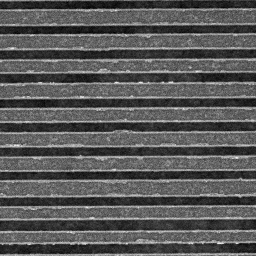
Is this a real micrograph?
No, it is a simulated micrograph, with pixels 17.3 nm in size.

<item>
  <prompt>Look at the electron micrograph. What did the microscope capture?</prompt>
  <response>parallel lines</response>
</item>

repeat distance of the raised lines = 0.423 µm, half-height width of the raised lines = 240 nm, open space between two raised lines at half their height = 0.175 um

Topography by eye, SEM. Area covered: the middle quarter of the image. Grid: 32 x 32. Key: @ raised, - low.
@@@@@@@@@@@@@@@@@@@@@@@@@@@@@@@@
@@@@@@@@@@@@@@@@@@@@@@@@@@@@@@@@
--------------------------------
--------------------------------
--------------------------------
@@@@@@@@@@@@@@@@@@@@@@@@@@@@@@@@
@@@@@@@@@@@@@@@@@@@@@@@@@@@@@@@@
@@@@@@@@@@@@@@@@@@@@@@@@@@@@@@@@
@@-@@@--------------------------
--------------------------------
--------------------------------
@@@@@@@@@@@@@@@@@@@@@@@@@@@@@@@@
@@@@@@@@@@@@@@@@@@@@@@@@@@@@@@@@
@@@@@@@@@@@@@@@@@@@@@@@@@@@@@@@@
--------------------------------
--------------------------------
--------------------------------
@@@@@@@@@@@@@@@@@@@@@@@@@@@@@@@@
@@@@@@@@@@@@@@@@@@@@@@@@@@@@@@@@
@@@@@@@@@@@@@@@@@@@@@@@@@@@@@@@@
@@@@@@@@@@@@@@@@----------------
--------------------------------
--------------------------------
@@@@@@@@@@@@@@@@@@@@@@@@@@@@@@@@
@@@@@@@@@@@@@@@@@@@@@@@@@@@@@@@@
@@@@@@@@@@@@@@@@@@@@@@@@@@@@@@@@
@@@@@@@@@@@@@@@@@@-----@@-------
--------------------------------
--------------------------------
@@@@@@@@@@@@@@@@@@@@@@@@@@@@@@@@
@@@@@@@@@@@@@@@@@@@@@@@@@@@@@@@@
@@@@@@@@@@@@@@@@@@@@@@@@@@@@@@@@